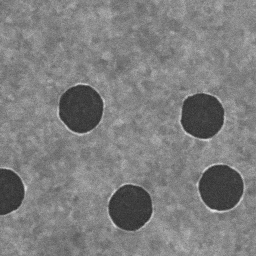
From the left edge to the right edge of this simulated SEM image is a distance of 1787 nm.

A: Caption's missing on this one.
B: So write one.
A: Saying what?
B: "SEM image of holes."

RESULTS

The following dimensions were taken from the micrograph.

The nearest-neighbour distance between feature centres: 581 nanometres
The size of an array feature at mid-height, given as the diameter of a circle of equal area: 322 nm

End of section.